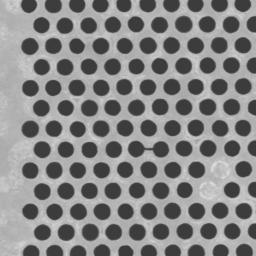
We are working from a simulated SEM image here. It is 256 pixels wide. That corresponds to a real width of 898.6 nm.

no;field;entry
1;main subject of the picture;a regular array of holes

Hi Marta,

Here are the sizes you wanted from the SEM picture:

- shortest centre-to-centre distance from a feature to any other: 82 nm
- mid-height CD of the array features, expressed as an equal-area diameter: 55.7 nm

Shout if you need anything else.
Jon